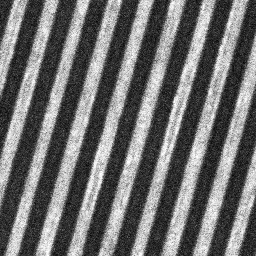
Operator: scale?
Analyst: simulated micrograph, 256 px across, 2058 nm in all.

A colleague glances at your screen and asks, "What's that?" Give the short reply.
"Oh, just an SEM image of parallel lines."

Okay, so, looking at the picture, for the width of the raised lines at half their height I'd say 14.9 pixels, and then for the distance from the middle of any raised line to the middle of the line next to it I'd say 243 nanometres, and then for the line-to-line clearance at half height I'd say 126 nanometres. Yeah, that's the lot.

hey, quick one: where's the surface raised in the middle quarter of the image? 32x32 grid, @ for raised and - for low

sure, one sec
@@----@@@@----@@@@----@@@@----@@
@@----@@@@----@@@@----@@@@----@@
@-----@@@@---@@@@----@@@@----@@@
@----@@@@----@@@@----@@@@----@@@
@----@@@@----@@@@----@@@@----@@@
@----@@@@----@@@-----@@@-----@@@
----@@@@----@@@@----@@@@----@@@@
----@@@@----@@@@----@@@@----@@@@
----@@@@----@@@@----@@@@----@@@-
----@@@@---@@@@----@@@@----@@@@-
---@@@@----@@@@----@@@@----@@@@-
---@@@@----@@@@----@@@@----@@@--
---@@@@----@@@-----@@@-----@@@--
--@@@@----@@@@----@@@@----@@@@--
--@@@@----@@@@----@@@@----@@@@--
--@@@@----@@@@----@@@@----@@@---
--@@@@----@@@----@@@@----@@@@---
-@@@@----@@@@----@@@@----@@@@---
-@@@@----@@@@----@@@@----@@@----
-@@@@----@@@-----@@@-----@@@----
@@@@----@@@@----@@@@----@@@@----
@@@@----@@@@----@@@@----@@@@----
@@@@----@@@@----@@@@----@@@----@
@@@@----@@@----@@@@----@@@@----@
@@@----@@@@----@@@@----@@@@----@
@@@----@@@@----@@@@----@@@----@@
@@@----@@@----@@@@-----@@@----@@
@@----@@@@----@@@@----@@@@----@@
@@----@@@@----@@@@----@@@@----@@
@@----@@@@----@@@@----@@@----@@@
@@----@@@----@@@@----@@@@----@@@
@----@@@@----@@@@----@@@@----@@@